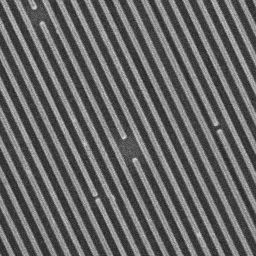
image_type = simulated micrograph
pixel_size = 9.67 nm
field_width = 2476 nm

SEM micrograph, parallel lines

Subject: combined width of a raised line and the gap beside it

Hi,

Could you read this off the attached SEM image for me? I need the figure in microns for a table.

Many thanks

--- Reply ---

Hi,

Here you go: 0.122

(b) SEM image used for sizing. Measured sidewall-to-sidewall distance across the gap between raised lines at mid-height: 8.01 px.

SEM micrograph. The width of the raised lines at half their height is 0.0426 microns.